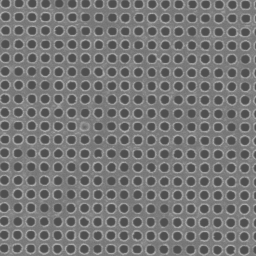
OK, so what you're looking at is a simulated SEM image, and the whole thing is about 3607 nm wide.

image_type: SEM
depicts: a regular array of holes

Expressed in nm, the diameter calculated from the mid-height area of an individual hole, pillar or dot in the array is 122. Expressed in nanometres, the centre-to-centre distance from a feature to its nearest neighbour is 183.